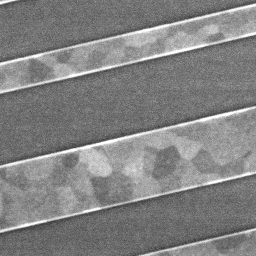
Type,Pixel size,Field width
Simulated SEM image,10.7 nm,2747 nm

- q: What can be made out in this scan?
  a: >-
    one or a few lines or trenches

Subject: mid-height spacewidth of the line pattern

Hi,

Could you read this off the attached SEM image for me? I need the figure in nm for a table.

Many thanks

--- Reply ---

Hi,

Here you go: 762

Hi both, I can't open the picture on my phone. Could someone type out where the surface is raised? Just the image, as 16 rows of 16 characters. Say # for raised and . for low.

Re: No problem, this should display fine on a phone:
...............#
...........#####
......########..
..########......
######..........
#...............
................
............####
........########
....############
################
#############...
#########.......
####............
...............#
...........#####